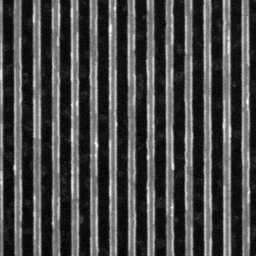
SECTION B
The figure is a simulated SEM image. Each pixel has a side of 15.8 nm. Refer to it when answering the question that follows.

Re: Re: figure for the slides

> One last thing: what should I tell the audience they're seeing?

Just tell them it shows parallel lines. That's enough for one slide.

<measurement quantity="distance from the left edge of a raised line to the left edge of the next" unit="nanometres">301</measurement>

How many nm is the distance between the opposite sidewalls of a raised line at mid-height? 99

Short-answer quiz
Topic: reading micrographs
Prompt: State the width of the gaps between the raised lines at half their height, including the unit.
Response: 196 nm